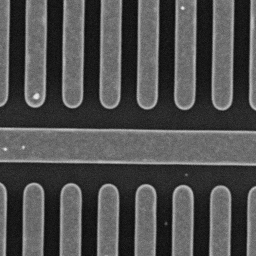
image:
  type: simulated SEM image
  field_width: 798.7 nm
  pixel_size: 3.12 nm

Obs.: groups of lines, slits or small figures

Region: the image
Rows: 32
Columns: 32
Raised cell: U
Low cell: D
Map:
UDDUUUDDUUUDDUUDDUUUDDUUUDDUUDDU
UDDUUUDDUUUDDUUDDUUUDDUUUDDUUDDU
UDDUUUDDUUDDDUUDDUUUDDUUUDDUUDDU
UDDUUUDDUUDDDUUDDUUUDDUUUDDUUDDU
UDDUUUDDUUDDDUUDDUUUDDUUUDDUUDDU
UDDUUUDDUUDDDUUDDUUUDDUUDDDUUDDU
UDDUUUDDUUDDDUUDDUUUDDUUDDDUUDDU
UDDUUUDDUUDDDUUDDUUUDDUUDDDUUDDU
UDDUUUDDUUDDDUUDDUUUDDUUDDDUUDDU
UDDUUUDDUUDDDUUDDUUUDDUUDDDUUDDU
UDDUUUDDUUDDDUUDDUUUDDUUDDDUUDDU
UDDUUUDDUUDDDUUDDUUUDDUUDDDUUDDU
UDDUUUDDUUDDDUUDDUUUDDUUDDDUUDDU
DDDDDDDDDDDDDUDDDDUDDDUUDDDUDDDD
DDDDDDDDDDDDDDDDDDDDDDDDDDDDDDDD
DDDDDDDDDDDDDDDDDDDDDDDDDDDDDDDD
UUUUUUUUUUUUUUUUUUUUUUUUUUUUUUUU
UUUUUUUUUUUUUUUUUUUUUUUUUUUUUUUU
UUUUUUUUUUUUUUUUUUUUUUUUUUUUUUUU
UUUUUUUUUUUUUUUUUUUUUUUUUUUUUUUU
DDDDDDDDDDDDDDDDDDDDDDDDUUUUUUUU
DDDDDDDDDDDDDDDDDDDDDDDDDDDDDDDD
DDDDDDDDDDDDDDDDDDDDDDDDDDDDDDDD
UDDUUDDDUUDDDUDDDUUDDDUUDDDUDDDD
UDDUUDDDUUDDUUUDDUUDDDUUDDUUUDDU
UDDUUDDDUUDDUUUDDUUDDDUUDDUUUDDU
UDDUUDDDUUDDUUUDDUUDDDUUDDUUUDDU
UDDUUDDDUUDDUUUDDUUDDDUUDDUUUDDU
UDDUUDDDUUDDUUUDDUUDDDUUDDUUUDDU
UDDUUDDDUUDDUUUDDUUDDDUUDDUUUDDU
UDDUUDDDUUDDUUUDDUUDDDUUDDUUUDDU
UDDUUDDDUUDDUUUDDUUDDDUUDDUUUDDU